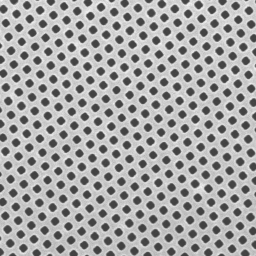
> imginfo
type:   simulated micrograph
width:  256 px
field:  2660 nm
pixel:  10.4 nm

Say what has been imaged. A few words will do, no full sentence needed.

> a regular array of holes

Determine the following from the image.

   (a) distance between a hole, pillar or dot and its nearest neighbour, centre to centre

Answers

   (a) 141 nm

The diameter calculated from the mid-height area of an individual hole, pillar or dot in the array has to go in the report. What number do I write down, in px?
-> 8.29